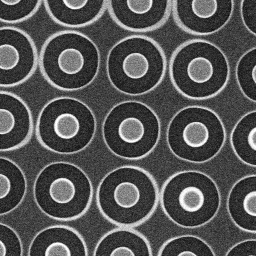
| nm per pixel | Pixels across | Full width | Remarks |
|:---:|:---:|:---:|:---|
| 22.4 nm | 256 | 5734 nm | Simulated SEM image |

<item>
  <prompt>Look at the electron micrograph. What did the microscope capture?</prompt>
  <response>an array of small figures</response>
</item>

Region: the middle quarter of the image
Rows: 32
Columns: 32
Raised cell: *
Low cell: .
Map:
****....***....******....**....*
****....***....******....**....*
........***.....****.....**....*
.......****.............***.....
.......*****............***.....
.....********..........*****....
**************.......********...
****************...***********..
.*******************************
....************..**************
.....********.......************
......******..........********..
.......****............*****....
***....****............*****....
***.....**.....****....****.....
***.....**....******....**.....*
***.....**....******....**....**
***....***....******....**....**
.......***.....****....***....**
......****.............***.....*
.....******............***......
....********..........*****.....
*************........*******....
****************..***********...
********************************
...*****************************
....*********......*************
.....******..........*******....
......****............*****.....
**....****............****......
**.....**....*****.....**.......
***....**....******....**......*